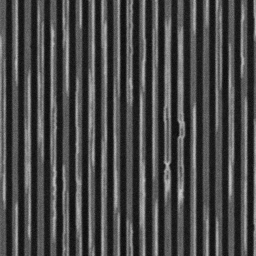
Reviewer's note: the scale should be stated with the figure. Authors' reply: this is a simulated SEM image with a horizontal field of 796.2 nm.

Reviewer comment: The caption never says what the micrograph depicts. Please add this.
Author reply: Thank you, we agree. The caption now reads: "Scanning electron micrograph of parallel lines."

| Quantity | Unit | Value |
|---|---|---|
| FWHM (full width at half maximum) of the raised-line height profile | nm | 16.3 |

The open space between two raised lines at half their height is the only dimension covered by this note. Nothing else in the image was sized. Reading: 0.0217 microns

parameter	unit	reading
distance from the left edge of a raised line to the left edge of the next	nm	39.5